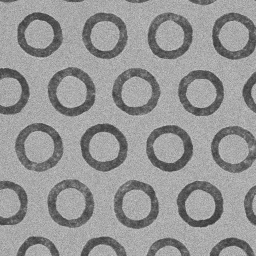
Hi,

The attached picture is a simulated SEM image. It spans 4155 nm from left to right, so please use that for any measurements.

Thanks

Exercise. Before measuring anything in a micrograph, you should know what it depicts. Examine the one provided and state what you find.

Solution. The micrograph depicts a regular array of ring-shaped grooves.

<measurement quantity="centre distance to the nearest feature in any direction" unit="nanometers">1040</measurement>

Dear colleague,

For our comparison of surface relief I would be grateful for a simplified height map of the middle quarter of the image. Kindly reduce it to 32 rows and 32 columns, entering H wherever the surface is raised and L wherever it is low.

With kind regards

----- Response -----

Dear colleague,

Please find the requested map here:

HHHHHHHHHHHHHHHHHHHHHHHHHHHHHHHH
LLLLHHHHHHHHHHHLLLLLLHHHHHHHHHHH
LLLLLLHHHHHHHHLLLLLLLLHHHHHHHHHL
HHHLLLLHHHHHHLLLLHHLLLLHHHHHHHLL
HHHHHLLHHHHHHLLHHHHHHLLHHHHHHLLL
HHHHHLLLHHHHLLLHHHHHHHLLHHHHHLLH
HHHHHHLLHHHHLLLHHHHHHHLLHHHHLLLH
HHHHHHLLHHHHLLLHHHHHHHLLHHHHLLLH
HHHHHLLLHHHHLLHHHHHHHHLLHHHHHLLH
HHHHHLLLHHHHHLLHHHHHHLLHHHHHHLLH
HHHHLLLHHHHHHLLLHHHLLLLHHHHHHHLL
LLLLLLHHHHHHHHLLLLLLLLHHHHHHHHLL
LLLLHHHHHHHHHHHHLLLLLHHHHHHHHHHH
HHHHHHHHHHHHHHHHHHHHHHHHHHHHHHHH
HHHHHHHHHHHHHHHHHHHHHHHHHHHHHHHH
HHHHHHHLLLLLHHHHHHHHHHHHHLLLLHHH
HHHHHHLLLLLLLLHHHHHHHHLLLLLLLLHH
HHHHHLLLHHHHLLLHHHHHHHLLLHHHLLLH
HHHHLLLHHHHHHLLHHHHHHLLHHHHHHLLL
HHHHLLLHHHHHHHLLHHHHHLLHHHHHHHLL
HHHHLLHHHHHHHHLLHHHHHLHHHHHHHHLL
HHHHLLHHHHHHHHLLHHHHLLLHHHHHHHLL
HHHHHLHHHHHHHHLLHHHHHLLHHHHHHHLL
HHHHHLLHHHHHHLLLHHHHHLLHHHHHHLLL
HHHHHHLLLLLLLLLHHHHHHHLLLHHHLLLH
HHHHHHHLLLLLLLHHHHHHHHHLLLLLLLHH
HHHHHHHHLLLLHHHHHHHHHHHHLLLLLHHH
HHHHHHHHHHHHHHHHHHHHHHHHHHHHHHHH
HHHHHHHHHHHHHHHHHHHHHHHHHHHHHHHH
LLLLHHHHHHHHHHHLLLLLHHHHHHHHHHHH
LLLLLLHHHHHHHHLLLLLLLLHHHHHHHHLL
HHHLLLLHHHHHHLLLLHHLLLHHHHHHHLLL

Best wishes